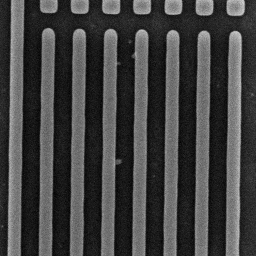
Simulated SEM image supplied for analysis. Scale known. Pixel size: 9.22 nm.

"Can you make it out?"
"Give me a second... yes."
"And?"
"groups of lines, slits or small figures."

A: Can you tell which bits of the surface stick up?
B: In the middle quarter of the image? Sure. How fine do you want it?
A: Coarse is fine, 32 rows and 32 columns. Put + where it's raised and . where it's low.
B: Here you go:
..+++.....+++.....+++.....+++...
..+++.....+++.....+++.....+++...
..+++.....+++.....+++.....+++...
..+++.....+++.....+++.....+++...
..+++.....+++.....+++.....+++...
..+++.....+++.....+++.....++....
..+++.....+++.....+++.....++....
..+++.....+++.....+++.....++....
..+++.....+++.....+++.....++....
..+++.....+++.....+++.....++....
..+++.....+++.....+++.....++....
..+++.....+++.....+++.....++....
..+++.....+++.....+++....+++....
..+++.....+++.....+++....+++....
..+++.....+++.....++.....+++....
..+++.....+++.....++.....+++....
..+++.....+++.....++.....+++....
..+++.....+++.....++.....+++....
..+++.....+++.....+++....+++....
..+++.....+++.....+++....+++....
..+++.....+++.....+++....+++....
..+++.....+++.....+++....+++....
..+++.....+++.....++.....+++....
..+++.....+++.....++.....+++....
..+++.....+++.....++.....+++....
..+++.....+++.....++.....+++....
..+++.....+++.....++.....+++....
..+++.....+++.....++.....+++....
..+++.....+++.....++.....+++....
..+++.....+++.....++.....+++....
..+++.....+++.....++.....+++....
..+++.....+++....+++.....+++....